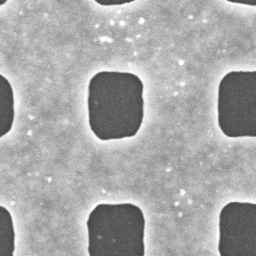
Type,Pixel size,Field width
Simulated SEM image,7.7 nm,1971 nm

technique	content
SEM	holes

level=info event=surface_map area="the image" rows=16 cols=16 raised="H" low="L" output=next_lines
HHHHHHHHHHHHHHHH
HHHHHHHHHHHHHHHH
HHHHHHHHHHHHHHHH
HHHHHHHHHHHHHHHH
HHHHHHLLHHHHHHHL
LHHHHLLLLHHHHHLL
LHHHHLLLLHHHHHLL
LHHHHHLLLHHHHHLL
HHHHHHLLHHHHHHLL
HHHHHHHHHHHHHHHH
HHHHHHHHHHHHHHHH
HHHHHHHHHHHHHHHH
HHHHHHHHHHHHHHHH
LHHHHHLLLHHHHHLL
LHHHHLLLLHHHHHLL
LHHHHLLLLHHHHHLL